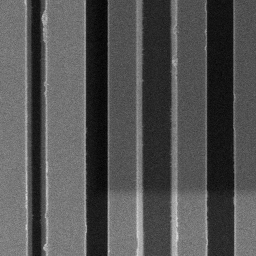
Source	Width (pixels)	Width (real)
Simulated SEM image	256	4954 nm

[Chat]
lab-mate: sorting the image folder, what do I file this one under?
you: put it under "lines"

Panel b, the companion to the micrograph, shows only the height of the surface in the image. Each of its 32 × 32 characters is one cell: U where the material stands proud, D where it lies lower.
UUUDDDUUUUUDDDUUUDDDDDUUUUDDDUUU
UUUDDUUUUUUDDDUUUDDDDDUUUUDDDUUU
UUUDDUUUUUUDDDUUUDDDDDUUUUDDDUUU
UUUDDUUUUUUDDDUUUDDDDDUUUUDDDUUU
UUUDDUUUUUUDDDUUUDDDDDUUUUDDDUUU
UUUDDDUUUUUDDDUUUDDDDDUUUUDDDUUU
UUUDDDUUUUUDDDUUUDDDDDUUUUDDDUUU
UUUDDDUUUUUDDDUUUDDDDDUUUUDDDUUU
UUUDDDUUUUUDDDUUUDDDDDUUUUDDDUUU
UUUDDDUUUUUDDDUUUDDDDDUUUUDDDUUU
UUUDDDUUUUUDDDUUUDDDDDUUUUDDDUUU
UUUDDDUUUUUDDDUUUDDDDDUUUUDDDUUU
UUUDDDUUUUUDDDUUUDDDDDUUUUDDDUUU
UUUDDDUUUUUDDDUUUDDDDDUUUUDDDUUU
UUUDDDUUUUUDDDUUUDDDDDUUUUDDDUUU
UUUDDDUUUUUDDDUUUDDDDDUUUUDDDUUU
UUUDDDUUUUUDDDUUUDDDDDUUUUDDDUUU
UUUDDDUUUUUDDDUUUDDDDDUUUUDDDUUU
UUUDDDUUUUUDDDUUUDDDDDUUUUDDDUUU
UUUDDDUUUUUDDDUUUDDDDDUUUUDDDUUU
UUUDDDUUUUUDDDUUUDDDDDUUUUDDDUUU
UUUDDDUUUUUDDDUUUDDDDDUUUUDDDUUU
UUUDDDUUUUUDDDUUUDDDDDUUUUDDDUUU
UUUDDDUUUUUDDDUUUDDDDDUUUUDDDUUU
UUUDDDUUUUUDDDUUUDDDDDUUUUDDDUUU
UUUDDDUUUUUDDDUUUDDDDDUUUUDDDUUU
UUUDDDUUUUUDDDUUUDDDDDUUUUDDDUUU
UUUDDDUUUUUDDDUUUDDDDDUUUUDDDUUU
UUUDDDUUUUUDDDUUUDDDDDUUUUDDDUUU
UUUDDDUUUUUDDDUUUDDDDDUUUUDDDUUU
UUUDDDUUUUUDDDUUUDDDDDUUUUDDDUUU
UUUDDDUUUUUDDDUUUDDDDDUUUUDDDUUU